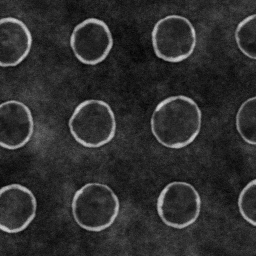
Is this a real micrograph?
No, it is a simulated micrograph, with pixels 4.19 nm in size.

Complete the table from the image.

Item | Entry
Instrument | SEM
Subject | raised bodies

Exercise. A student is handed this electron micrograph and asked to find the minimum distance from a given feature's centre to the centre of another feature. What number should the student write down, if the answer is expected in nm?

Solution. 347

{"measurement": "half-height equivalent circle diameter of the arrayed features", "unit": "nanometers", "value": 189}